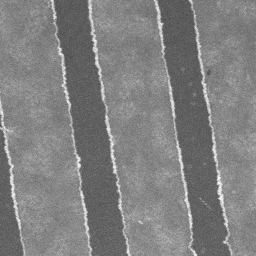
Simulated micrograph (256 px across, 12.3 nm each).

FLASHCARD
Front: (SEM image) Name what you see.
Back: one or a few lines or trenches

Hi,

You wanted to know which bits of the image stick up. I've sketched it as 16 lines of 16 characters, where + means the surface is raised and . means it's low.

...+++....++....
...+++....++....
....++....++....
....++....+++...
....++....+++...
....++.....++...
....+++....++...
....+++....++...
.....++....++...
+....++....++...
+....++....+++..
+....++....+++..
+....+++....++..
+....+++....++..
+....+++....++..
+.....++....++..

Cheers